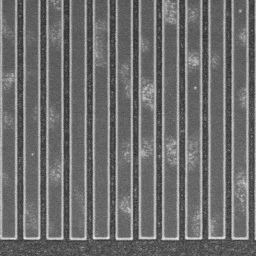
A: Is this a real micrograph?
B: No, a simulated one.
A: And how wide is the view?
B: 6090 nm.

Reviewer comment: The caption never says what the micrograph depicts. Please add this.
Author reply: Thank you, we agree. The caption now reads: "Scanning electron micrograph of parallel lines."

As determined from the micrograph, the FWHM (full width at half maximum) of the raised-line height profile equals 357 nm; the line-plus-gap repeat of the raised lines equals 550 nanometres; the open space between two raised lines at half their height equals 0.187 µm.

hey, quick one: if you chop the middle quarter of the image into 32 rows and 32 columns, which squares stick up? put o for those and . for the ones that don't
..ooo..oooo..oooo..oooo..ooo...o
..ooo..oooo..oooo..oooo..oooo..o
..ooo..oooo..oooo..oooo..oooo..o
..ooo..oooo..oooo..oooo..oooo..o
..ooo..oooo..oooo..oooo..oooo..o
..ooo..oooo..oooo..oooo..ooo...o
..ooo..oooo..oooo..oooo..ooo...o
..ooo..oooo..oooo..oooo..ooo...o
..ooo..oooo..oooo..oooo..ooo...o
..ooo..oooo..oooo..oooo..ooo...o
..ooo..oooo..oooo..oooo..ooo...o
..ooo..oooo..oooo..oooo..ooo...o
..ooo..oooo..oooo..oooo..ooo...o
..ooo..oooo..oooo..oooo..ooo...o
..ooo..oooo..oooo..oooo..ooo...o
..ooo..oooo..oooo..oooo..ooo...o
..ooo..oooo..oooo..oooo..ooo...o
..ooo..oooo..oooo..oooo..oooo..o
..ooo..oooo..oooo..oooo..oooo..o
..ooo..oooo..oooo..oooo..ooo...o
..ooo..oooo..oooo..oooo..ooo...o
..ooo..oooo..oooo..oooo..ooo...o
..ooo..oooo..oooo..oooo..ooo...o
..ooo..oooo..oooo..oooo..oooo..o
..ooo..oooo..oooo..oooo..oooo..o
..ooo..oooo..oooo..oooo..oooo..o
..ooo..oooo..oooo..oooo..oooo..o
..ooo..oooo..oooo..oooo..oooo..o
..ooo..oooo..oooo..oooo..oooo..o
..ooo..oooo..oooo..oooo..oooo..o
..ooo..oooo..oooo..oooo..oooo..o
..ooo..oooo..oooo..oooo..oooo..o